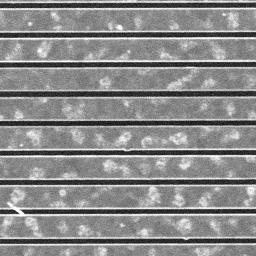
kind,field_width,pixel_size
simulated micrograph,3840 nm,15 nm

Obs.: parallel lines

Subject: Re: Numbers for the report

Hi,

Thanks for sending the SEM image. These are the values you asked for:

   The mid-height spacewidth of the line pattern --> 84.4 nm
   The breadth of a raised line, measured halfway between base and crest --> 0.349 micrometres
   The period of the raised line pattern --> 29.5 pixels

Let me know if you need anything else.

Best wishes